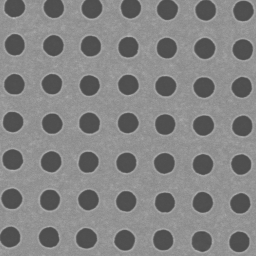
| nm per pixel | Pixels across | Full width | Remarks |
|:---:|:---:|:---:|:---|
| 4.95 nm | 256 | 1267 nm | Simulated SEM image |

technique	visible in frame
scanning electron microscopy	a regular array of holes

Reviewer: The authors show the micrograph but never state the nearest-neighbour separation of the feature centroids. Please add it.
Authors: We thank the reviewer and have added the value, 186 nanometres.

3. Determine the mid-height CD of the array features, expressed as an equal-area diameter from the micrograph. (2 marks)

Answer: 103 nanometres